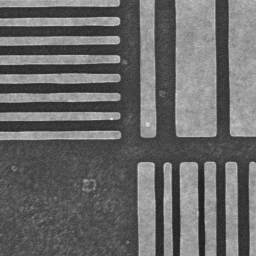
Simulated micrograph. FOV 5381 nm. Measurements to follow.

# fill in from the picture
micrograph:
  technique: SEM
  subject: groups of lines, slits or small figures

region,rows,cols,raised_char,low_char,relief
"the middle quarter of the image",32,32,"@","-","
-------------------@@@@-----@@@@
-------------------@@@@-----@@@@
-------------------@@@@-----@@@@
@@@@@@@@@@@@@@-----@@@@-----@@@@
@@@@@@@@@@@--------@@@@-----@@@@
-------------------@@@@-----@@@@
-------------------@@@@-----@@@@
@@@@@@@@@@@@@@-----@@@@-----@@@@
@@@@@@@@@@@@@@-----@@@@-----@@@@
-------------------@@@@-----@@@@
-------------------@@@@-----@@@@
-------------------@@@@-----@@@@
@@@@@@@@@@@@@@-----@@@@-----@@@@
@@@@@@@@@@@@@@-----@@@@-----@@@@
-------------------@@@@-----@@@@
-------------------@@@@-----@@@@
-------------------@@@@-----@@@@
@@@@@@@@@@@@@@-----@@@@-----@@@@
@@@@@@@@@@@@@@------------------
--------------------------------
--------------------------------
--------------------------------
--------------------------------
--------------------------------
--------------------------------
-------------------@@@@--@@--@@@
-------------------@@@@--@@--@@@
-------------------@@@@--@@--@@@
-------------------@@@@--@@--@@@
-------------------@@@@--@@--@@@
-------------------@@@@--@@--@@@
-------------------@@@@--@@--@@@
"